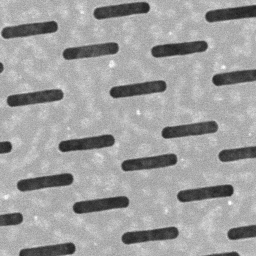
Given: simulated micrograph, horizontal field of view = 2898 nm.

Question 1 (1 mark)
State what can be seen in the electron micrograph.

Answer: a regular array of holes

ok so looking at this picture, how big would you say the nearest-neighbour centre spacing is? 650 nanometers